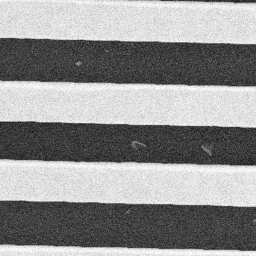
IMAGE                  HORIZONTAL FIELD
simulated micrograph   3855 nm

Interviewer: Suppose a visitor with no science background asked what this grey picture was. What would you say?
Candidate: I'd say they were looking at lines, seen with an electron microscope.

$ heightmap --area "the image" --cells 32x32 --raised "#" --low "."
#############################...
################################
################################
################################
################################
................................
................................
................................
................................
................................
#########.......................
################################
################################
################################
################################
................################
................................
................................
................................
................................
#################...............
################################
################################
################################
################################
......................##########
................................
................................
................................
................................
................................
################################